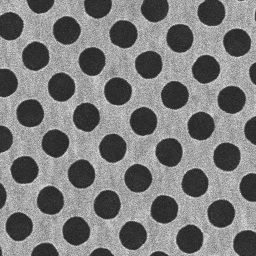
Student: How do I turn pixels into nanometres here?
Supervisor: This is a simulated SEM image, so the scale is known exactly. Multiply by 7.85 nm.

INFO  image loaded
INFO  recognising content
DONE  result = a regular array of holes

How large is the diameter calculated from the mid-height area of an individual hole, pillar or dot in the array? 220 nanometres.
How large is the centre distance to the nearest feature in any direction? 313 nm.